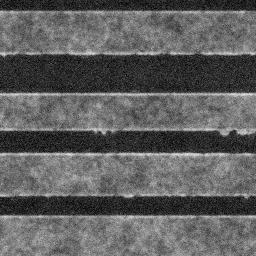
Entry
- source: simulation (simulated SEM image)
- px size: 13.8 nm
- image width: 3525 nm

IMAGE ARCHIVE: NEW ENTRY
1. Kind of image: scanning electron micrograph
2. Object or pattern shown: lines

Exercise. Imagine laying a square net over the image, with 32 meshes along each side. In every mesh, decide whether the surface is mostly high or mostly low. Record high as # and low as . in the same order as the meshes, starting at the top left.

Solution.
................................
################################
################################
################################
################################
################################
################################
................................
................................
................................
................................
................................
################################
################################
################################
################################
............................#.#.
................................
................................
################################
################################
################################
################################
################################
................................
................................
................................
################################
################################
################################
################################
################################